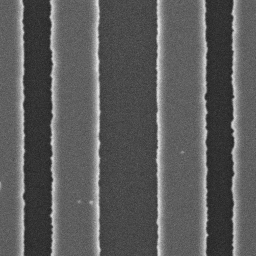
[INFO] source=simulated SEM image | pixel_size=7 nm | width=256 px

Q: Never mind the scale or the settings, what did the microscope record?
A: lines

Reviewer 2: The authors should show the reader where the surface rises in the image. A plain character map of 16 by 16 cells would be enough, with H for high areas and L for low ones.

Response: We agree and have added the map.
HLLHHHLLLLHHHLLH
HLLHHHLLLLHHHLLH
HLLHHHLLLLHHHLLH
HLLHHHLLLLHHHLLH
HLLHHHLLLLHHHLLH
HLLHHHLLLLHHHLLH
HLLHHHLLLLHHHLLH
HLLHHHLLLLHHHLLH
HLLHHHLLLLHHHLLH
HLLHHHLLLLHHHLLH
HLLHHHLLLLHHHLLH
HLLHHHLLLLHHHLLH
HLLHHHLLLLHHHLLH
HLLHHHLLLLHHHLLH
HLLHHHLLLLHHHLLH
HLLHHHLLLLHHHLLH